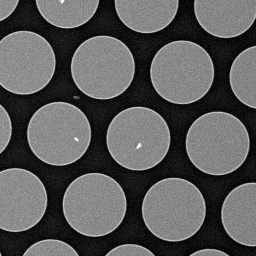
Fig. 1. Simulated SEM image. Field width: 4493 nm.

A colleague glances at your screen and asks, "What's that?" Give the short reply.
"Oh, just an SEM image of an array of small figures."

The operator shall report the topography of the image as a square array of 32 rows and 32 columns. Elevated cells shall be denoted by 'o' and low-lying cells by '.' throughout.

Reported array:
oo...ooooooo..oooooooo..oooooooo
oo...ooooooo...ooooooo..oooooooo
......ooooo....ooooooo...ooooooo
................oooo.....oooooo.
.oooo......................ooo..
oooooo....oooooo.....ooo........
ooooooo..ooooooo....oooooo....oo
ooooooo..oooooooo..ooooooo...ooo
ooooooo..oooooooo..oooooooo..ooo
ooooooo..oooooooo..oooooooo..ooo
oooooo...ooooooo...ooooooo...ooo
.ooo......ooooo.....oooooo...ooo
.....................oooo.....oo
.....ooooo......oo..............
o...ooooooo....ooooo.....oooo...
o...ooooooo...ooooooo...oooooo..
o..oooooooo..oooooooo...ooooooo.
o...ooooooo..oooooooo..oooooooo.
o...ooooooo..oooooooo..oooooooo.
.....ooooo....ooooooo...ooooooo.
......ooo......ooooo....oooooo..
oooo......................ooo...
ooooo....ooooo......ooo.........
oooooo...oooooo....oooooo....ooo
oooooo..oooooooo..ooooooo...oooo
oooooo..oooooooo..oooooooo..oooo
oooooo..oooooooo..oooooooo..oooo
ooooo...ooooooo...ooooooo...oooo
oooo.....oooooo....oooooo...oooo
...........o........oooo.....ooo
....oooo......................oo
...oooooo.....ooooo......ooo....